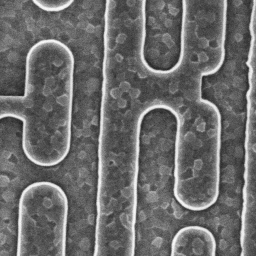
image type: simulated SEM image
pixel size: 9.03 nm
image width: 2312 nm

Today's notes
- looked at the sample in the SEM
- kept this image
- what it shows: one or a few lines or trenches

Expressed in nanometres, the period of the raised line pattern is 687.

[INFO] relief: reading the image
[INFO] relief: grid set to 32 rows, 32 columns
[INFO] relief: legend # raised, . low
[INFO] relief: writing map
.....####....#####.....#####....
.............#####.....#####....
.............#####.....#####...#
.............#####.....#####...#
.............#####.....#####....
.....###.....#####.....#####...#
....#####....#####.....#####...#
...######....#####.....#####...#
...######....######...#####....#
...######....############......#
...######....############......#
...######....############......#
#########....############......#
#########....######..######....#
#########....#####....#####....#
...######....####.....#####....#
...######....####.....#####....#
...######....####.....#####....#
...######....####.....#####....#
....####....#####.....#####....#
.....##......####.....#####....#
............#####.....#####....#
............#####.....#####....#
....###.....#####.....#####....#
...#####....#####.....#####....#
...#####....#####......###.....#
...#####....#####.............##
..######....#####.............##
..######....#####.......#.....##
..######....#####.....####....##
..######....#####.....#####...##
..######....#####.....#####...##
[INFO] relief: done